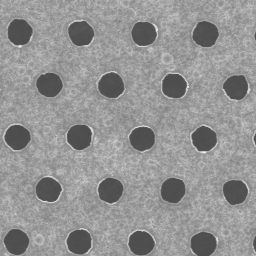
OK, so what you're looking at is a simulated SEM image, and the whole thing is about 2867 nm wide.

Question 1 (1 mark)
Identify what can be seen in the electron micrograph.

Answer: a regular array of holes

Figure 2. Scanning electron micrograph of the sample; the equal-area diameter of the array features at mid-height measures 25.4 px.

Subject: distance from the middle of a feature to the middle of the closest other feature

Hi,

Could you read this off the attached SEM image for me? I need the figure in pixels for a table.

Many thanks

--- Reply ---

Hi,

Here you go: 60.4